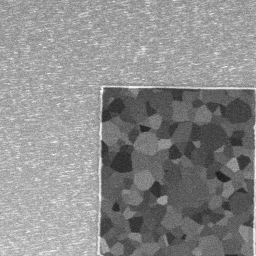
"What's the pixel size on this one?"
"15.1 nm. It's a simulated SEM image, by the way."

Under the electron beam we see one or a few lines or trenches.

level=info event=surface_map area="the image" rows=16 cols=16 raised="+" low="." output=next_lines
................
................
................
................
................
.......+++++....
......++++++++++
......++++++++++
......++++++++++
......++++++++++
......++++++++++
......++++++++++
......++++++++++
......++++++++++
......++++++++++
......++++++++++